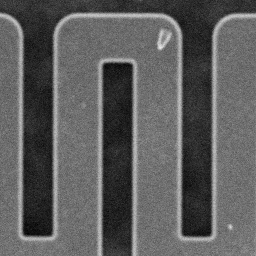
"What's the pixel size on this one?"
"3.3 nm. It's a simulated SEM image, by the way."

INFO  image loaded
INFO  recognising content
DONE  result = groups of lines, slits or small figures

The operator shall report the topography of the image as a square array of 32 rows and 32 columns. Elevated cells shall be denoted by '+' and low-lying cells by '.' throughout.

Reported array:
................................
................................
++......++++++++++++++......++++
++.....+++++++++++++++.....+++++
+++....++++++++++++++++....+++++
+++....++++++++++++++++....+++++
+++....++++++++++++++++....+++++
+++....++++++++++++++++....+++++
+++....++++++....++++++....+++++
+++....++++++....++++++....+++++
+++....++++++....++++++....+++++
+++....++++++....++++++....+++++
+++....++++++....++++++....+++++
+++....++++++....++++++....+++++
+++....++++++....++++++....+++++
+++....++++++....++++++....+++++
+++....++++++....++++++....+++++
+++....++++++....++++++....+++++
+++....++++++....++++++....+++++
+++....++++++....++++++....+++++
+++....++++++....++++++....+++++
+++....++++++....++++++....+++++
+++....++++++....++++++....+++++
+++....++++++....++++++....+++++
+++....++++++....++++++....+++++
+++....++++++....++++++....+++++
+++....++++++....++++++....+++++
+++....++++++....++++++....+++++
+++....++++++....++++++....+++++
+++...+++++++....++++++...++++++
+++++++++++++....+++++++++++++++
+++++++++++++....+++++++++++++++